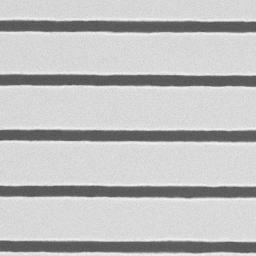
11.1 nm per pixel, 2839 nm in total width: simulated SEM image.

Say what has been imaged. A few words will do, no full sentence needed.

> lines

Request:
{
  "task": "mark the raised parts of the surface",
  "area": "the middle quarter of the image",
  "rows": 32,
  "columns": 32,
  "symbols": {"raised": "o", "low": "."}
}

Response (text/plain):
oooooooooooooooooooooooooooooooo
oooooooooooooooooooooooooooooooo
oooooooooooooooooooooooooooooooo
................................
................................
oooooooo.ooooo..oo..oo..........
oooooooooooooooooooooooooooooooo
oooooooooooooooooooooooooooooooo
oooooooooooooooooooooooooooooooo
oooooooooooooooooooooooooooooooo
oooooooooooooooooooooooooooooooo
oooooooooooooooooooooooooooooooo
oooooooooooooooooooooooooooooooo
oooooooooooooooooooooooooooooooo
oooooooooooooooooooooooooooooooo
oooooooooooooooooooooooooooooooo
..o.ooo...oooooooooooooooooooooo
................................
................................
oooooooooooooooooooooooooooooooo
oooooooooooooooooooooooooooooooo
oooooooooooooooooooooooooooooooo
oooooooooooooooooooooooooooooooo
oooooooooooooooooooooooooooooooo
oooooooooooooooooooooooooooooooo
oooooooooooooooooooooooooooooooo
oooooooooooooooooooooooooooooooo
oooooooooooooooooooooooooooooooo
oooooooooooooooooooooooooooooooo
oooooooooooooooooooooooooooooooo
..........oooooooooooooooooooooo
................................